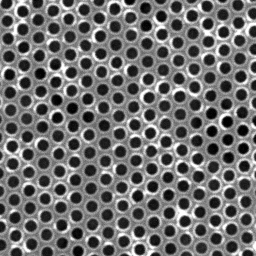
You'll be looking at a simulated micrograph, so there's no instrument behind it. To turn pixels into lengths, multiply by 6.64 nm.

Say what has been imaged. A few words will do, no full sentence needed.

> a regular array of holes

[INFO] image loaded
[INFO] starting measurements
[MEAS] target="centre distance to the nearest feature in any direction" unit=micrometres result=0.117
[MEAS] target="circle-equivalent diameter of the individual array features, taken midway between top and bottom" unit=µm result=0.0829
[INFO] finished